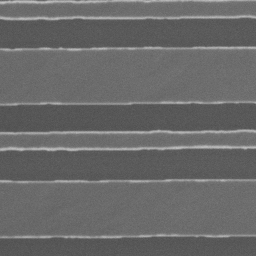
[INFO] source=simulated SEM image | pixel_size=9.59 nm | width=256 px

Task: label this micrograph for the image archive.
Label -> lines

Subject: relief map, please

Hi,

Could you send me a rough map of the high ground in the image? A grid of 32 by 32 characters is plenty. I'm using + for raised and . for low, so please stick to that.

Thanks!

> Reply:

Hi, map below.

++++++++++++++++++++++++++++++++
++++++++++++++++++++++++++++++++
................................
................................
................................
................................
++++++++++++++++++++++++++++++++
++++++++++++++++++++++++++++++++
++++++++++++++++++++++++++++++++
++++++++++++++++++++++++++++++++
++++++++++++++++++++++++++++++++
++++++++++++++++++++++++++++++++
++++++++++++++++++++++++++++++++
................................
................................
................................
......+.++++++++++++++++++++++++
++++++++++++++++++++++++++++++++
+++++++++++++++++++++++.........
................................
................................
................................
................................
++++++++++++++++++++++++++++++++
++++++++++++++++++++++++++++++++
++++++++++++++++++++++++++++++++
++++++++++++++++++++++++++++++++
++++++++++++++++++++++++++++++++
++++++++++++++++++++++++++++++++
+++++++++++++++++++......++++...
................................
................................